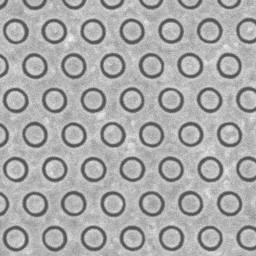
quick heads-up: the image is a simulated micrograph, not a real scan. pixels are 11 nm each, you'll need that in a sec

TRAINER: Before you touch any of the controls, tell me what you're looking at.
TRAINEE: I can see a regular array of ring-shaped grooves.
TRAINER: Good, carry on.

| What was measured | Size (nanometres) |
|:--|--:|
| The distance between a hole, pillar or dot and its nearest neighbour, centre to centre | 427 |